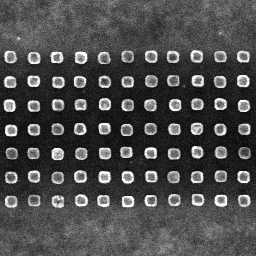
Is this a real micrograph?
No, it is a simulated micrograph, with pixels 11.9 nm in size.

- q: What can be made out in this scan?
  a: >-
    a regular array of raised bodies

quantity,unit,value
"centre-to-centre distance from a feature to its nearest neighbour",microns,0.27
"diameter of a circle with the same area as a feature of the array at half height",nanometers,150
